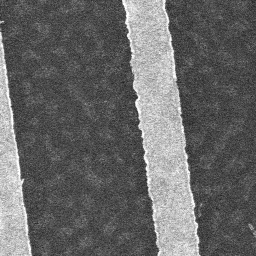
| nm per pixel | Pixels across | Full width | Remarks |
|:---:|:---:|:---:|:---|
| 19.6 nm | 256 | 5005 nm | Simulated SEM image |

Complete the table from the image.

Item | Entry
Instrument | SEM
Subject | one or a few lines or trenches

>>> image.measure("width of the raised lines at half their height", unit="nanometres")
803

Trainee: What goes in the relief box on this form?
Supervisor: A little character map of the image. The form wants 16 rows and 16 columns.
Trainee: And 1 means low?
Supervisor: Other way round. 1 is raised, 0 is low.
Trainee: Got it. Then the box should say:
0000000011000000
0000000011100000
0000000011100000
0000000011100000
0000000011100000
0000000011100000
1000000001100000
1000000001100000
1000000001110000
1000000001110000
1000000001110000
1000000001110000
1000000001110000
1100000000110000
1100000000110000
1100000000110000